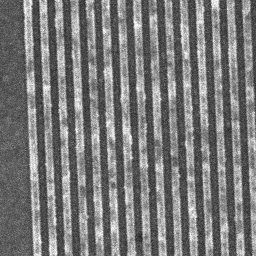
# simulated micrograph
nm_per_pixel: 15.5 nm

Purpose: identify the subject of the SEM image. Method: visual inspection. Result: parallel lines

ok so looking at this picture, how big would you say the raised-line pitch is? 242 nm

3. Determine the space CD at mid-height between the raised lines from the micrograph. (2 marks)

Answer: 0.135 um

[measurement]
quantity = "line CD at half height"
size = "104 nm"